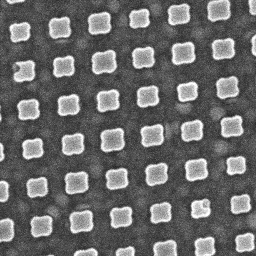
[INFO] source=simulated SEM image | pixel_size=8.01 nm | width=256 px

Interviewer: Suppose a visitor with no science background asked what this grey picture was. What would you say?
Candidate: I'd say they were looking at a regular array of raised bodies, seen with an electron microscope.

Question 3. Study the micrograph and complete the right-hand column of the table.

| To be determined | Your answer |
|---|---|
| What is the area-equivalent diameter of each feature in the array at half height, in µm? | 0.17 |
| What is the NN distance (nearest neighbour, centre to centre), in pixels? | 38.9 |